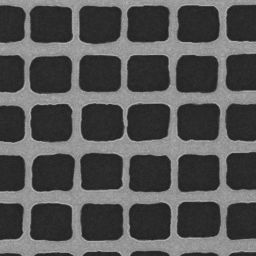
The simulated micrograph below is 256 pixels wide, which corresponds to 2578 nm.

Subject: a regular array of holes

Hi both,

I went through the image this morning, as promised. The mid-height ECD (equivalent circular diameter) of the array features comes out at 436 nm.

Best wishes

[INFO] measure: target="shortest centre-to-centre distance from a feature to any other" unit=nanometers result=484